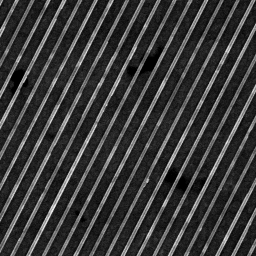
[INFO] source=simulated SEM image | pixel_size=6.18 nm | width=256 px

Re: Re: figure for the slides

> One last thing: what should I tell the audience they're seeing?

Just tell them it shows parallel lines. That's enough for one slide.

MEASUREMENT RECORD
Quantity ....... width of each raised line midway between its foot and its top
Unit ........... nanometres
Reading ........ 17.9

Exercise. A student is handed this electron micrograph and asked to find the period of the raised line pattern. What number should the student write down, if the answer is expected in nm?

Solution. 86.7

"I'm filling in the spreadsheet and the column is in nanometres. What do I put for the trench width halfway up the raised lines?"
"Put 70.1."